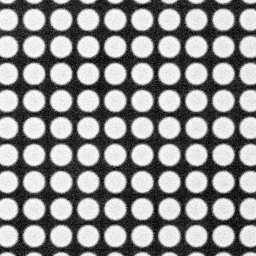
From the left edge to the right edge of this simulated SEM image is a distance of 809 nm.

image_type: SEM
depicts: an array of small figures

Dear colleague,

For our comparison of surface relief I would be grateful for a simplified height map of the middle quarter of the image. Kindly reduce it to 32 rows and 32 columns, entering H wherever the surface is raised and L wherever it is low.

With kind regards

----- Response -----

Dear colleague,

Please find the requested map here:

HLLLHHHHLLLHHHHLLLHHHLLLLHHHLLLH
HHLLHHHHLLHHHHHLLHHHHHLLHHHHHLLH
HHLLHHHHHLHHHHHLLHHHHHLLHHHHHLLH
HHLLHHHHLLHHHHHLLHHHHHLLHHHHHLLH
HLLLHHHHLLLHHHLLLLHHHLLLLHHHLLLL
LLLLLLLLLLLLLLLLLLLLLLLLLLLLLLLL
LLLLLLLLLLLLLLLLLLLLLLLLLLLLLLLL
HLLLHHHHLLLHHHHLLLHHHHLLHHHHLLLH
HHLLHHHHHLHHHHHLLHHHHHLLHHHHHLLH
HHLLHHHHHLHHHHHLLHHHHHLLHHHHHLLH
HHLLHHHHLLLHHHHLLHHHHHLLHHHHHLLH
LLLLLHHLLLLLHHLLLLHHHLLLLHHHLLLL
LLLLLLLLLLLLLLLLLLLLLLLLLLLLLLLL
LLLLLLLLLLLLLLLLLLLLLLLLLLLLLLLL
HLLLHHHHLLLHHHHLLLHHHHLLHHHHLLLH
HHLLHHHHHLHHHHHLLHHHHHLLHHHHHLLH
HHLLHHHHHLHHHHHLLHHHHHLLHHHHHLLH
HLLLHHHHLLLHHHHLLLHHHHLLHHHHLLLH
LLLLLHHLLLLLHHLLLLLHLLLLLLHLLLLL
LLLLLLLLLLLLLLLLLLLLLLLLLLLLLLLL
LLLLLHHLLLLLHHLLLLHHHLLLLHHHLLLL
HLLLHHHHLLLHHHHLLHHHHHLLHHHHHLLH
HHLLHHHHHLHHHHHLLHHHHHLLHHHHHLLH
HHLLHHHHLLHHHHHLLHHHHHLLHHHHHLLH
HLLLHHHHLLLHHHHLLLHHHLLLHHHHLLLH
LLLLLLLLLLLLLLLLLLLLLLLLLLLLLLLL
LLLLLLLLLLLLLLLLLLLLLLLLLLLLLLLL
HLLLLHHHLLLHHHLLLLHHHLLLLHHHLLLL
HHLLHHHHLLLHHHHLLHHHHHLLHHHHHLLH
HHLLHHHHHLHHHHHLLHHHHHLLHHHHHLLH
HHLLHHHHLLHHHHHLLHHHHHLLHHHHHLLH
HLLLHHHHLLLHHHHLLLHHHLLLLHHHLLLL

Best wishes